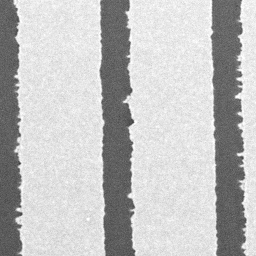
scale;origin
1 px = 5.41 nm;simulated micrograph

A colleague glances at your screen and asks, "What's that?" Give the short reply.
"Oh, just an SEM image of lines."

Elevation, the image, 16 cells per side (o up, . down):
.ooooo..ooooo..o
.ooooo..ooooo..o
.ooooo..ooooo..o
.ooooo..ooooo..o
.ooooo..ooooo..o
.ooooo..ooooo..o
.ooooo..ooooo..o
.ooooo..ooooo..o
.ooooo..ooooo..o
.ooooo..ooooo..o
.ooooo..ooooo..o
.ooooo..ooooo..o
.ooooo..ooooo..o
.ooooo..ooooo..o
.ooooo..ooooo..o
.oooooo.ooooo..o